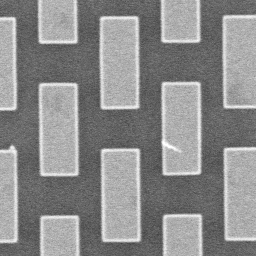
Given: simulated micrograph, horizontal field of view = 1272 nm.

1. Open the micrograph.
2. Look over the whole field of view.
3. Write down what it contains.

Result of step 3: groups of lines, slits or small figures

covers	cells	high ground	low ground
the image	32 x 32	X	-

-----XXXX-----------XXXXX-------
-----XXXX-----------XXXXX-------
XX---XXXX----XXXX---XXXXX---XXXX
XX---XXXX----XXXX---XXXXX---XXXX
XX---XXXX----XXXX---XXXXX---XXXX
XX-----------XXXX-----------XXXX
XX-----------XXXX-----------XXXX
XX-----------XXXX-----------XXXX
XX-----------XXXX-----------XXXX
XX-----------XXXX-----------XXXX
XX---XXXX----XXXX---XXXXX---XXXX
XX---XXXX----XXXX---XXXXX---XXXX
XX---XXXX----XXXX---XXXXX---XXXX
XX---XXXX----XXXX---XXXXX-------
-----XXXXX----------XXXXX-------
-----XXXXX----------XXXXX-------
-----XXXXX----------XXXXX-------
-----XXXXX----------XXXXX-------
-----XXXXX----------XXXXX-------
XX---XXXXX---XXXX---XXXXX---XXXX
XX---XXXXX---XXXX---XXXXX---XXXX
XX---XXXXX---XXXX---XXXXX---XXXX
XX-----------XXXX-----------XXXX
XX-----------XXXX-----------XXXX
XX-----------XXXX-----------XXXX
XX-----------XXXX-----------XXXX
XX-----------XXXX-----------XXXX
XX---XXXXX---XXXX----XXXX---XXXX
XX---XXXXX---XXXX----XXXX---XXXX
XX---XXXXX---XXXX----XXXX---XXXX
-----XXXXX-----------XXXX-------
-----XXXXX-----------XXXX-------